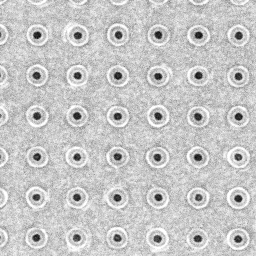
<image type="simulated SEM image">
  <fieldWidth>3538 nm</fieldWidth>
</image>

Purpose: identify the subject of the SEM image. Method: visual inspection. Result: a regular array of ring-shaped raised bodies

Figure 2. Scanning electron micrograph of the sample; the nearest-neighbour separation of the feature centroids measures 0.553 um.